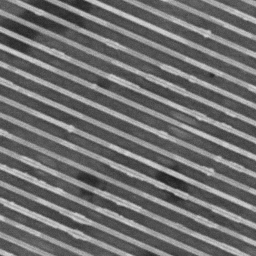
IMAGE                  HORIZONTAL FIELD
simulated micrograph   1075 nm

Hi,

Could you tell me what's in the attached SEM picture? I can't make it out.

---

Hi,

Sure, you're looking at parallel lines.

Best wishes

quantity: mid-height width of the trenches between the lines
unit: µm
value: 0.0485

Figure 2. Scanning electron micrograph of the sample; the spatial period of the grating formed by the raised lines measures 65.8 nm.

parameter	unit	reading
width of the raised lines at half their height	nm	16.4